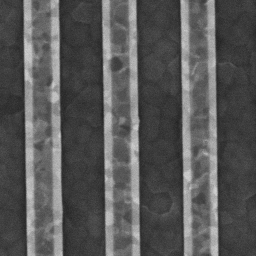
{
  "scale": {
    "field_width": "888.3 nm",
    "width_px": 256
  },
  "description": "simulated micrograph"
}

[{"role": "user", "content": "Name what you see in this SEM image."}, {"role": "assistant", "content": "one or a few lines or trenches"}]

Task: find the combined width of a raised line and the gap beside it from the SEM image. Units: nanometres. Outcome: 272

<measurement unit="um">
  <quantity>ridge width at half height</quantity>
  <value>0.1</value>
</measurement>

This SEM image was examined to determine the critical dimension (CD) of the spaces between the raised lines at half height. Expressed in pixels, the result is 50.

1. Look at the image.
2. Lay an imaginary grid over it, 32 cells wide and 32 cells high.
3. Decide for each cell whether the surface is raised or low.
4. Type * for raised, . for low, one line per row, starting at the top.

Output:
...****......****......***......
...****......****......****.....
...****......****......****.....
...****......****......****.....
...****......****......****.....
...****......****......****.....
...****......****......****.....
...****......****......****.....
...****......****......****.....
...****......****......****.....
...****......****......****.....
...****......****......****.....
...****......****......****.....
...****......****......****.....
...****......****......****.....
....***......****......****.....
....***......****......****.....
....***......****......****.....
....***......****......****.....
....***......****......****.....
....***......****......****.....
....***......****......****.....
....***......****......****.....
....***......****......****.....
....***......****......****.....
....***.......***......****.....
....***.......***......****.....
....***.......***......****.....
....***.......***......****.....
....***.......***......****.....
....***.......***......****.....
....***.......***......****.....